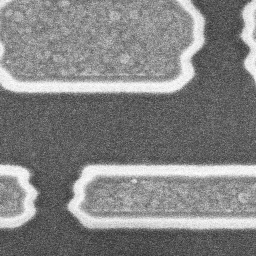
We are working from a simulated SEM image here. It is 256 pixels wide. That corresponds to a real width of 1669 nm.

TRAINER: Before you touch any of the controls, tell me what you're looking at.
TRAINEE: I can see one or a few lines or trenches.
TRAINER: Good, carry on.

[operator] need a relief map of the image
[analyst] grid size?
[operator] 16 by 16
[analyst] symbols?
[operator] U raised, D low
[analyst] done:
UUUUUUUUUUUUDDDD
UUUUUUUUUUUUDDDD
UUUUUUUUUUUUDDDD
UUUUUUUUUUUUDDDD
UUUUUUUUUUUUDDDD
DDDDDDDDDDDDDDDD
DDDDDDDDDDDDDDDD
DDDDDDDDDDDDDDDD
DDDDDDDDDDDDDDDD
DDDDDDDDDDDDDDDD
DDDDDDDDDDDDDDDD
UUDDDUUUUUUUUUUU
UUDDDUUUUUUUUUUU
UUDDDUUUUUUUUUUU
DDDDDDDDDDDDDDDD
DDDDDDDDDDDDDDDD